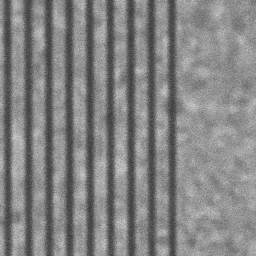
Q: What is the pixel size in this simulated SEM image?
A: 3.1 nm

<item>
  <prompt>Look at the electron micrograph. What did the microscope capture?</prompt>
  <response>parallel lines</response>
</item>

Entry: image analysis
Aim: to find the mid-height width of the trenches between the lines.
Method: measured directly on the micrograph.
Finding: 30.2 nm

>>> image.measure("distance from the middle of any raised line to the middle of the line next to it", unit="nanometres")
63.7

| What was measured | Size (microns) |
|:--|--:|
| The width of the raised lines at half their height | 0.0333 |